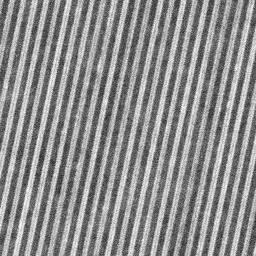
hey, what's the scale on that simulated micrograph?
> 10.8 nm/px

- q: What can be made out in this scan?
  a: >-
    parallel lines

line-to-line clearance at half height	83.3	nm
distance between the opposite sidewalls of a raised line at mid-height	41	nm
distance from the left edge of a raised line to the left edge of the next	0.121	µm